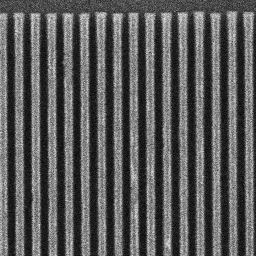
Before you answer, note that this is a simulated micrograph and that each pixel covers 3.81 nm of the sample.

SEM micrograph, parallel lines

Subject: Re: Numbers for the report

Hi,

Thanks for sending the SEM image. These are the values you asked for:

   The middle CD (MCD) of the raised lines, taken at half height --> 0.0328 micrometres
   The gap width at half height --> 29.5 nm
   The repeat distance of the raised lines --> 62.5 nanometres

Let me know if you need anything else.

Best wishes